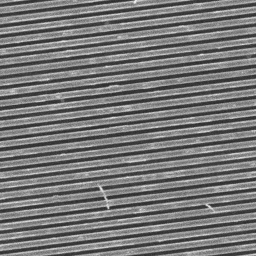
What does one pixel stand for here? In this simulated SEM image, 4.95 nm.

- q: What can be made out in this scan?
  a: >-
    parallel lines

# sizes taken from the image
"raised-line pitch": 50.6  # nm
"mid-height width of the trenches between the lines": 20.8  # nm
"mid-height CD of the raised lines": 29.4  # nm